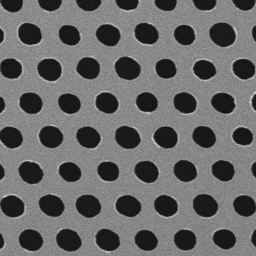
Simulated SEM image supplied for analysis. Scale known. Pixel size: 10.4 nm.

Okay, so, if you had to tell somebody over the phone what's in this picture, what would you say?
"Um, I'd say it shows a regular array of holes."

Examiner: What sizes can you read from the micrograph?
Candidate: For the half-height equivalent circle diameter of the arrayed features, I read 235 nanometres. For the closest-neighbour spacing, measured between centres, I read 38.1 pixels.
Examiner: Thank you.